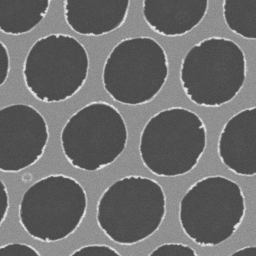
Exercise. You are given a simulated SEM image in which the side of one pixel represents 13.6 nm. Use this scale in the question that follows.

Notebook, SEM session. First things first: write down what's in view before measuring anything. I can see a regular array of holes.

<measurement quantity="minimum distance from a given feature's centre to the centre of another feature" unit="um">1.07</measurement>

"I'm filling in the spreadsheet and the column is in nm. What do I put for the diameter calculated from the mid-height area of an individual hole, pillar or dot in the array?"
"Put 878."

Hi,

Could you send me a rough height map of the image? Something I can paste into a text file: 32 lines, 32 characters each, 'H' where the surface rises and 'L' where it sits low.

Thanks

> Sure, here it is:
LLLLLLHHLLLLLLLLHHLLLLLLLLHHLLLL
LLLLLHHHLLLLLLLLHHLLLLLLLLHHLLLL
LLLLLHHHHLLLLLLHHHLLLLLLLHHHLLLL
LLLLHHHHHLLLLLHHHHHLLLLLHHHHHLLL
HHHHHHLHHHHHHHHHHHHHHHHHHHHHHHHL
HHHHLLLLLLHHHHHLLLLLHHHHHLLLLHHH
LHHHLLLLLLLHHHLLLLLLHHHHLLLLLLHH
LHHLLLLLLLLHHLLLLLLLLHHLLLLLLLHH
LHHLLLLLLLLHHLLLLLLLLHHLLLLLLLLH
LHHLLLLLLLLHHLLLLLLLLHHLLLLLLLLH
HHHLLLLLLLHHHLLLLLLLHHHLLLLLLLHH
HHHHLLLLLHHHHHLLLLLLHHHHLLLLLLHH
HHHHHHLLHHHHHHHLLLHHHHHHLLLLLHHH
HLLLHHHHHHHLLLHHHHHHHHHHHHHHHHHH
LLLLLHHHHLLLLLLHHHHLLLLLLHHHHLLL
LLLLLLHHLLLLLLLLHHLLLLLLLHHHLLLL
LLLLLLHHLLLLLLLLHHLLLLLLLHHHLLLL
LLLLLLHHLLLLLLLLHHLLLLLLLLHHLLLL
LLLLLHHHLLLLLLLHHHLLLLLLLHHHLLLL
LLLLLHHHLLLLLLLHHHLLLLLLLHHHLLLL
LLLLHHHHHLLLLHHHHHLLLLLLHHHHLLLL
HHHHHHHHHHHHHHHHHHHLLLLHHHHHHHLL
HHHHHLLLLHHHHHHLLLLHHHHHHHLLLHHH
LHHHLLLLLLHHHHLLLLLLHHHHLLLLLLHH
LHHLLLLLLLLHHLLLLLLLHHHLLLLLLLHH
LHHLLLLLLLLHLLLLLLLLLHHLLLLLLLHH
LHHLLLLLLLHHLLLLLLLLHHHLLLLLLLHH
HHHLLLLLLLHHLLLLLLLLHHHLLLLLLLHH
HHHLLLLLLHHHHLLLLLLLHHHLLLLLLHHH
HHHHLLLLHHHHHHLLLLHHHHHHLLLLLHHH
HHHHHHHHHHHHHHHHHHHHHHHHHHLHHHHH
LLLLHHHHHHLLLLHHHHHLLLLLHHHHHHLL